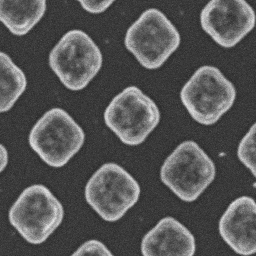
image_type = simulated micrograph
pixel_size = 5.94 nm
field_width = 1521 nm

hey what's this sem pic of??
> a regular array of raised bodies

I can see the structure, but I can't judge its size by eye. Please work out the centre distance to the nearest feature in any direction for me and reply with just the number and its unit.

78.7 px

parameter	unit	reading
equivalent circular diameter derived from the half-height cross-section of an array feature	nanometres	300